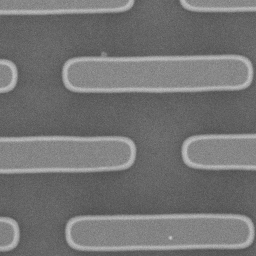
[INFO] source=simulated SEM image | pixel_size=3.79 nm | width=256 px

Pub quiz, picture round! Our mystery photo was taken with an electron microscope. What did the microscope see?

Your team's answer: groups of lines, slits or small figures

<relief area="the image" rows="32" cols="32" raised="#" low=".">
################.......#########
########........................
................................
................................
................................
................................
................................
.........######################.
##......#######################.
##......#######################.
##......#######################.
................................
................................
................................
................................
................................
................................
################........########
#################......#########
#################......#########
################........########
................................
................................
................................
................................
................................
................................
#........######################.
##.......######################.
##......########################
##.......######################.
................................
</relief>